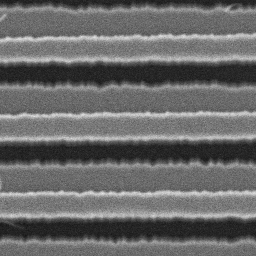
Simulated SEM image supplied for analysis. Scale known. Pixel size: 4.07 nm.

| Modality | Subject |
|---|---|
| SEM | lines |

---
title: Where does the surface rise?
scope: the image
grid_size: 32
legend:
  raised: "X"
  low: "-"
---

--------------------------------
XXXXXXXXXXXXXXXXXXXXXXXXXXXXXXXX
XXXXXXXXXXXXXXXXXXXXXXXXXXXXXXXX
XXXXXXXXXXXXXXXXXXXXXXXXXXXXXXXX
XXXXXXXXXXXXXXXXXXXXXXXXXXXXXXXX
XXXXXXXXXXXXXXXXXXXXXXXXXXXXXXXX
XXXXXXXXXXXXXXXXXXXXXXXXXXXXXXXX
XXXXXXXXXXXXXXXXXXXXXXXXXXXXXXXX
--------------------------------
--------------------------------
X--X---XX----XXXX------XXXXX----
XXXXXXXXXXXXXXXXXXXXXXXXXXXXXXXX
XXXXXXXXXXXXXXXXXXXXXXXXXXXXXXXX
XXXXXXXXXXXXXXXXXXXXXXXXXXXXXXXX
XXXXXXXXXXXXXXXXXXXXXXXXXXXXXXXX
XXXXXXXXXXXXXXXXXXXXXXXXXXXXXXXX
XXXXXXXXXXXXXXXXXXXXXXXXXXXXXXXX
XXXXXXXXXXXXXXXXXXXXXXXXXXXXXX-X
--------------------------------
--------------------------------
-XXXXXXXXXXXXXXXXXXXXXXXXXXXXXXX
XXXXXXXXXXXXXXXXXXXXXXXXXXXXXXXX
XXXXXXXXXXXXXXXXXXXXXXXXXXXXXXXX
XXXXXXXXXXXXXXXXXXXXXXXXXXXXXXXX
XXXXXXXXXXXXXXXXXXXXXXXXXXXXXXXX
XXXXXXXXXXXXXXXXXXXXXXXXXXXXXXXX
XXXXXXXXXXXXXXXXXXXXXXXXXXXXXXXX
--------------------------------
--------------------------------
--------------------------------
XXXXXXXXXXXXXXXXXXXXXXXXXXXXXXXX
XXXXXXXXXXXXXXXXXXXXXXXXXXXXXXXX